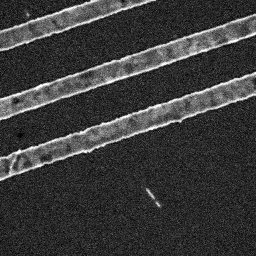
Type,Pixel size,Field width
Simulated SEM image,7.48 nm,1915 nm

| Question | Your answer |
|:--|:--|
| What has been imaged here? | one or a few lines or trenches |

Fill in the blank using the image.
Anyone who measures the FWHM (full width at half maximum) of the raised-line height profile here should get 146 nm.